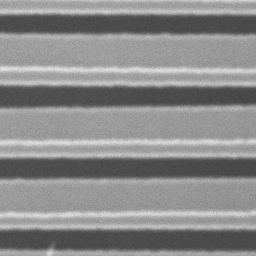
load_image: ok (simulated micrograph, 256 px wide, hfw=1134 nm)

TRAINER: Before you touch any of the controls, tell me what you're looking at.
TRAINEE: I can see lines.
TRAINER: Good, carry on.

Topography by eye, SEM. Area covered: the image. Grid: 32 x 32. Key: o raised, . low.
oooooooooooooooooooooooooooooooo
oooooooooooooooooooooooooooooooo
................................
................................
oooooooooooooooooooooooooooooooo
oooooooooooooooooooooooooooooooo
oooooooooooooooooooooooooooooooo
oooooooooooooooooooooooooooooooo
oooooooooooooooooooooooooooooooo
oooooooooooooooooooooooooooooooo
oooooooooooooooooooooooooooooooo
................................
................................
...............ooooooooooooooooo
oooooooooooooooooooooooooooooooo
oooooooooooooooooooooooooooooooo
oooooooooooooooooooooooooooooooo
oooooooooooooooooooooooooooooooo
oooooooooooooooooooooooooooooooo
oooooooooooooooooooooooooooooooo
................................
................................
.......oo.o..oo.o..ooooooooooooo
oooooooooooooooooooooooooooooooo
oooooooooooooooooooooooooooooooo
oooooooooooooooooooooooooooooooo
oooooooooooooooooooooooooooooooo
oooooooooooooooooooooooooooooooo
oooooooooooooooooooooooooooooooo
................................
................................
ooooooooo.o.ooo...o.o...........